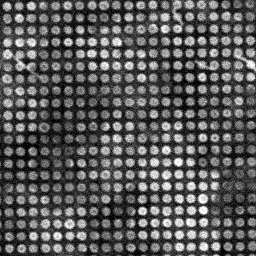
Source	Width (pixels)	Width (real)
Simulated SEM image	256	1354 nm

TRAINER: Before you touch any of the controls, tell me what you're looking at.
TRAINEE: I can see a regular array of raised bodies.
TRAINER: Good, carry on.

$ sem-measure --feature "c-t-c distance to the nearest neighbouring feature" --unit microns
0.0626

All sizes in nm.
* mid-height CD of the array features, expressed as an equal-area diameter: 43